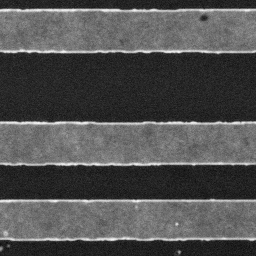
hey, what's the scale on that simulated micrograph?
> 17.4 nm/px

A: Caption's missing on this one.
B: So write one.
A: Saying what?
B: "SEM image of lines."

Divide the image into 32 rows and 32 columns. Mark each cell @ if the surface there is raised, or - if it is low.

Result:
--------------------------------
@@@@@@@@@@@@@@@@@@@@@@@@@@@@@@@@
@@@@@@@@@@@@@@@@@@@@@@@@@@@@@@@@
@@@@@@@@@@@@@@@@@@@@@@@@@@@@@@@@
@@@@@@@@@@@@@@@@@@@@@@@@@@@@@@@@
@@@@@@@@@@@@@@@@@@@@@@@@@@@@@@@@
@@@@@@@@@@@@@@@@@@@-@@@--@@@@@@@
--------------------------------
--------------------------------
--------------------------------
--------------------------------
--------------------------------
--------------------------------
--------------------------------
--------------------------------
@@@@@@@@@@@@@@@@@@@@@@@@@@@@@@@@
@@@@@@@@@@@@@@@@@@@@@@@@@@@@@@@@
@@@@@@@@@@@@@@@@@@@@@@@@@@@@@@@@
@@@@@@@@@@@@@@@@@@@@@@@@@@@@@@@@
@@@@@@@@@@@@@@@@@@@@@@@@@@@@@@@@
@@@@@@-@@@@@@@@@@@@@----@-----@-
--------------------------------
--------------------------------
--------------------------------
--------------------------------
@@@@@@@@@@@@@@@@@@@@@@@@@@@@@@@@
@@@@@@@@@@@@@@@@@@@@@@@@@@@@@@@@
@@@@@@@@@@@@@@@@@@@@@@@@@@@@@@@@
@@@@@@@@@@@@@@@@@@@@@@@@@@@@@@@@
@@@@@@@@@@@@@@@@@@@@@@@@@@@@@@@@
--------------------------------
--------------------------------